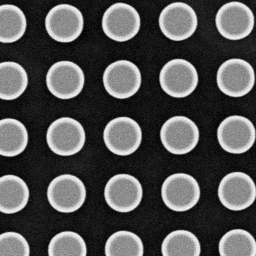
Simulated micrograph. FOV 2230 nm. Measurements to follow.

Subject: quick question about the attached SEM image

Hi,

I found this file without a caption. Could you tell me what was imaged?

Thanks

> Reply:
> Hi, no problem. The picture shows an array of small figures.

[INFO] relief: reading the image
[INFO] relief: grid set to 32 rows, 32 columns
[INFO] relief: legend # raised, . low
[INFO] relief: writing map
..............##.....##.....##..
###...####...####...####...####.
###...####...####...#####..#####
###...####...####...####...#####
###...####....###....###....###.
................................
................................
......................#......#..
###...####...####...####...#####
###...####...#####..#####..#####
###...####...#####..#####..#####
###...####...####....###....###.
................................
................................
................................
###...####....###....###....###.
###...#####..#####..#####..#####
###...#####..#####..#####..#####
###...####....###....###....###.
................................
................................
................................
###....###....###....###....###.
###...#####..#####..#####..#####
####..#####..#####..#####..#####
###...####....###....###....###.
##......#.......................
................................
................................
###....###....###....###....###.
###...#####..#####..#####..#####
####..#####..#####..#####..#####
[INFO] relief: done